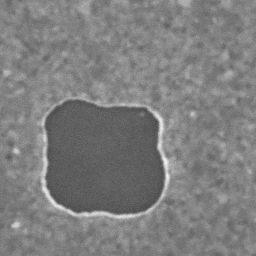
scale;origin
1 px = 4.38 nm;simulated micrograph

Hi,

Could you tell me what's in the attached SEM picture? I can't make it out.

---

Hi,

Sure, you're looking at holes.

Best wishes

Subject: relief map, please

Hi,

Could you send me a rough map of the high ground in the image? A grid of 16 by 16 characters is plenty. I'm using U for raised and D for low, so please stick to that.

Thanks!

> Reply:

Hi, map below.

UUUUUUUUUUUUUUUU
UUUUUUUUUUUUUUUU
UUUUUUUUUUUUUUUU
UUUUUUUUUUUUUUUU
UUUUUUUUUUUUUUUU
UUUUUUUUUUUUUUUU
UUUUDDUUUUUUUUUU
UUUDDDDDDDUUUUUU
UUUDDDDDDDUUUUUU
UUUDDDDDDDUUUUUU
UUUDDDDDDDUUUUUU
UUUDDDDDDDUUUUUU
UUUDDDDDDDUUUUUU
UUUUUUUUUUUUUUUU
UUUUUUUUUUUUUUUU
UUUUUUUUUUUUUUUU